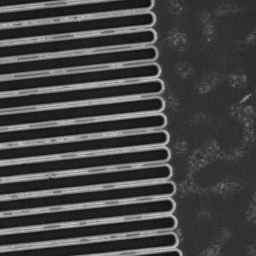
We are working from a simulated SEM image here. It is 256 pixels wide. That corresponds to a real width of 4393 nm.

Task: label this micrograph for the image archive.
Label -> parallel lines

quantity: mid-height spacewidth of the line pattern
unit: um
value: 0.213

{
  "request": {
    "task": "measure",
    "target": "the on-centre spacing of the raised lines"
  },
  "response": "293 nanometres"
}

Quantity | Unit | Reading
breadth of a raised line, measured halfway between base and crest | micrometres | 0.0833